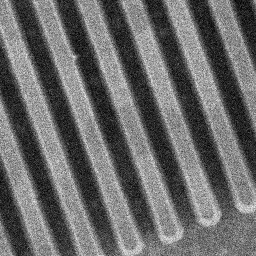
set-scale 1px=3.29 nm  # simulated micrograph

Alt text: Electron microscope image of parallel lines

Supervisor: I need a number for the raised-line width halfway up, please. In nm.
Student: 68.2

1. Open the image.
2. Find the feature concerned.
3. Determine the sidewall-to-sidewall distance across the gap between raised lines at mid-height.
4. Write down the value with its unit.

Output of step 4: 68.2 nm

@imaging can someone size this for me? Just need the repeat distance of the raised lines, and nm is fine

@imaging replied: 136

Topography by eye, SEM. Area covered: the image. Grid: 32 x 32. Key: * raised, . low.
*...***...**...***...**...***...
**...**...***...**...***...**...
**...***..***...***..***...***..
**...***...**...***...***..***..
***...**...***...**...***...**..
***...***...**...***..***...***.
.***..***...***..***...***..***.
.***...***..***...**...***...**.
.***...***...**...***...**...***
..***..***...***..***...***..***
..***...**...***...***..***...**
...**...***...**...***...**...**
...***...**...***...**...***...*
*..***...***..***...***..***...*
*...**...***...**...***...**...*
*...***...**...***...**...***...
**..***...***..***...***..***...
**...**...***...**...***...***..
**...***...**...***...**...***..
***..***...***..***...***...**..
***...***..***...***..***...***.
.**...***...**...***...***..***.
.***...**...***...**...***...**.
.***...***..***...***..***...***
..**...***...***..***...***..***
..***...**...***...**...***...**
..***...***..***...***...**.....
...***..***...***..***...**.....
...***...**...***...**..........
*...**...***...**...**..........
*...***..***...***..............
**..***...***...*...............